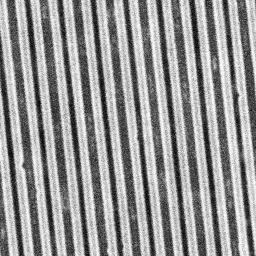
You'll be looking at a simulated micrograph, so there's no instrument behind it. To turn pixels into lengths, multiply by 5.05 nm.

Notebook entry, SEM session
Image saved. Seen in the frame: parallel lines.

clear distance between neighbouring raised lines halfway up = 38.2 nm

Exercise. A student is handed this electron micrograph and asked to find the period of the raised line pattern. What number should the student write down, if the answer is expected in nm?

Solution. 82.5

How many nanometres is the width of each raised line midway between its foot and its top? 38.2